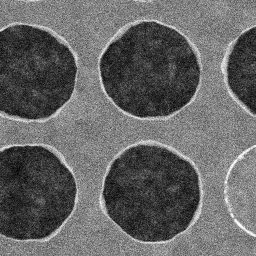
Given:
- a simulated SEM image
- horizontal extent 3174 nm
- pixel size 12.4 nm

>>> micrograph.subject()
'holes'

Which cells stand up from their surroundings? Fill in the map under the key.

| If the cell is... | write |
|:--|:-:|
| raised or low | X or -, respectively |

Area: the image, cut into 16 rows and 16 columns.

XXXXXXXXXXXXXXXX
XXXXXXXX--XXXXXX
----XXX-----XXX-
-----X------XX--
-----X-------X--
-----XX-----XX--
----XXX-----XXX-
XXXXXXXXXXXXXXXX
XXXXXXXXXXXXXXXX
---XXXXX---XXXXX
----XXX-----XXXX
-----X-------XXX
-----X-------XXX
----XXX-----XXXX
---XXXXX---XXXXX
XXXXXXXXXXXXXXXX